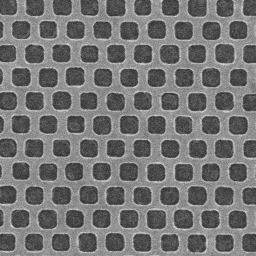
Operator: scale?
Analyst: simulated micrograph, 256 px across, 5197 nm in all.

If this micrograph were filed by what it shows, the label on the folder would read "a regular array of holes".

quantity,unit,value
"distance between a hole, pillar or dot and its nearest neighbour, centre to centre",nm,544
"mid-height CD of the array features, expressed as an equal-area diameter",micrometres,0.407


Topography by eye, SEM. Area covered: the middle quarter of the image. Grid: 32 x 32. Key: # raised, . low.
################################
#....###....##....###....###....
.....##.....##.....##....###....
.....##.....##....###.....##....
.....##.....##.....##....###....
#...####....###...###....###....
################################
..##....###....###....###...###.
..##.....##....##.....##.....##.
..##....###....##.....##.....##.
..##....###....##.....##.....##.
.####..####....####..####...####
################################
#....##.....##....###....###....
#....##.....##.....##.....##....
#....##.....##.....##.....##....
#....##.....##.....##....###....
########...####...####..#####..#
################################
..##....###....###...####....###
..##.....##....##.....##.....##.
..##.....##....##.....##.....##.
.###....###....##.....##.....##.
######.###################.#####
################################
.....##.....##....###....###....
.....##.....##.....##.....##....
.....##.....##.....##.....##....
#....##....###....###....###....
##############################.#
#####..#########################
..##....###....##.....##.....##.